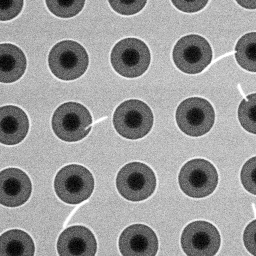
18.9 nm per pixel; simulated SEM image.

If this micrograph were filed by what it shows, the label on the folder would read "an array of small figures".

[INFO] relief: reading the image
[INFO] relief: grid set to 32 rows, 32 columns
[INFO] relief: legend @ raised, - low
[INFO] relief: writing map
---@@@-----@@@----@@@@----@@@@--
---@@@----@@@@---@@@@@@--@@@@@@@
-@@@@@@@@@@@@@@@@@@@@@@@@@@@@@@@
@@@@@@@@@@@@@@@@@@@@@@@@@@@@@@@@
@@@@@@@@@@@@@@@@@@@@@@@--@@@@@--
--@@@@@---@@@@----@@@@----@@@---
---@@@-----@@@-----@@------@@---
---@@@-----@@@-----@@@-----@@---
---@@@-----@@@-----@@@----@@@@--
---@@@@---@@@@@--@@@@@@@@@@@@@@@
@@@@@@@@@@@@@@@@@@@@@@@@@@@@@@@@
@@@@@@@@@@@@@@@@@@@@@@@@@@@@@@@@
@@@@@@@@@@@@@@@@-@@@@@@---@@@@--
---@@@@----@@@@----@@@-----@@@--
---@@@@----@@@-----@@@-----@@@--
----@@------@@-----@@@-----@@@--
----@@@----@@@@----@@@@---@@@@@-
---@@@@@--@@@@@@@@@@@@@@@@@@@@@@
@@@@@@@@@@@@@@@@@@@@@@@@@@@@@@@@
@@@@@@@@@@@@@@@@@@@@@@@@@@@@@@@@
@@@@@@@@@-@@@@@@--@@@@@----@@@--
---@@@@----@@@@----@@@-----@@@--
----@@@-----@@------@@-----@@@--
----@@@-----@@@-----@@@----@@@--
----@@@----@@@@----@@@@---@@@@@@
---@@@@@--@@@@@@@@@@@@@@@@@@@@@@
@@@@@@@@@@@@@@@@@@@@@@@@@@@@@@@@
@@@@@@@@@@@@@@@@@@@@@@@@@@@@@@@@
@@@@@@@@---@@@@@---@@@@----@@@@-
----@@@-----@@@-----@@@-----@@--
----@@@-----@@@-----@@@-----@@--
----@@@-----@@@-----@@@----@@@@-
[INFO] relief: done